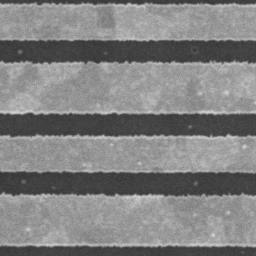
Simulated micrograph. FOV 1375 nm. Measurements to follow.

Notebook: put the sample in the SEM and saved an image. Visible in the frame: lines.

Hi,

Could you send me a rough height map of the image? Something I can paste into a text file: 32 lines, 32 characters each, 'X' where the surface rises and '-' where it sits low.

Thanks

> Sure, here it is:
-X--X-X---X-------X------X------
XXXXXXXXXXXXXXXXXXXXXXXXXXXXXXXX
XXXXXXXXXXXXXXXXXXXXXXXXXXXXXXXX
XXXXXXXXXXXXXXXXXXXXXXXXXXXXXXXX
XXXXXXXXXXXXXXXXXXXXXXXXXXXXXXXX
--------------------------------
--------------------------------
--------------------------------
XXXXXXXXXXXXXXXXXXXXXXXXXXXXXXXX
XXXXXXXXXXXXXXXXXXXXXXXXXXXXXXXX
XXXXXXXXXXXXXXXXXXXXXXXXXXXXXXXX
XXXXXXXXXXXXXXXXXXXXXXXXXXXXXXXX
XXXXXXXXXXXXXXXXXXXXXXXXXXXXXXXX
XXXXXXXXXXXXXXXXXXXXXXXXXXXXXXXX
--------------------------------
--------------------------------
--------------------------------
XXXXXXXXXXXXXXXXXXXXXXXXXXXXXXXX
XXXXXXXXXXXXXXXXXXXXXXXXXXXXXXXX
XXXXXXXXXXXXXXXXXXXXXXXXXXXXXXXX
XXXXXXXXXXXXXXXXXXXXXXXXXXXXXXXX
-----------X----X-X-XX--X-----XX
--------------------------------
--------------------------------
XXXXXXXXXXXXXXXXXXXXXX-XXXXXXXXX
XXXXXXXXXXXXXXXXXXXXXXXXXXXXXXXX
XXXXXXXXXXXXXXXXXXXXXXXXXXXXXXXX
XXXXXXXXXXXXXXXXXXXXXXXXXXXXXXXX
XXXXXXXXXXXXXXXXXXXXXXXXXXXXXXXX
XXXXXXXXXXXXXXXXXXXXXXXXXXXXXXXX
XXXXXXXXXXXXXXXXXXXXXXXXXXXXXXXX
--------------------------------